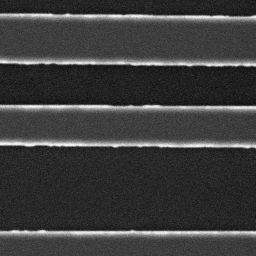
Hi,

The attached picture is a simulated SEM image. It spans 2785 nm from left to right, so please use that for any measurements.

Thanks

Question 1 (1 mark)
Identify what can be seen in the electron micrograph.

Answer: lines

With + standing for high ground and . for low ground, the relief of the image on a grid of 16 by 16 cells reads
................
++++++++++++++++
++++++++++++++++
++++++++++++++++
................
................
................
++++++++++++++++
++++++++++++++++
................
................
................
................
................
+++.....+.......
++++++++++++++++